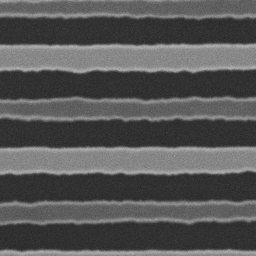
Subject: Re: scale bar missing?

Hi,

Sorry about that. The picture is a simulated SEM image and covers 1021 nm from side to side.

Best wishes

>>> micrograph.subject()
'lines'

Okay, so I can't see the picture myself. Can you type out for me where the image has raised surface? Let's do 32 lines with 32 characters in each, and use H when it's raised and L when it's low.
HHHHHHHHHHHHHHHHHHHHHHHHHHHHHHHH
HHHHHHHHHHHHHHHHHHHHHHHHHHHHHHHH
LLLLLLLLLLLLLLLLLLLLLLLLLLLLLLLL
LLLLLLLLLLLLLLLLLLLLLLLLLLLLLLLL
LLLLLLLLLLLLLLLLLLLLLLLLLLLLLLLL
LLLLLLLLLLLLLLLLLLLLLLLLLLLLLLLL
HHHHHHHHHHHHHHHHHHHHHHHHHHHHHHHH
HHHHHHHHHHHHHHHHHHHHHHHHHHHHHHHH
HHHHHHHHHHHHHHHHHHHHHHHHHHHHHHHH
LLLLLLLLLLLLLLLLLLLLLLLLLLLLLLLL
LLLLLLLLLLLLLLLLLLLLLLLLLLLLLLLL
LLLLLLLLLLLLLLLLLLLLLLLLLLLLLLLL
LLHLLHHHHHHHHHHHHHLLHHHHHHHHHHHH
HHHHHHHHHHHHHHHHHHHHHHHHHHHHHHHH
HHHHHHHHHHHHHHHHHHHHHHHHHHHHHHHH
LLLLLLLLLLLLLLLLLLLLLLLLLLLLLLLL
LLLLLLLLLLLLLLLLLLLLLLLLLLLLLLLL
LLLLLLLLLLLLLLLLLLLLLLLLLLLLLLLL
LLLHHHLLLLHHHHHHLHHHHLHHHHLLHHHH
HHHHHHHHHHHHHHHHHHHHHHHHHHHHHHHH
HHHHHHHHHHHHHHHHHHHHHHHHHHHHHHHH
HHHHHHHHHHHHHHHHHHHHHHHHHHHHHHLL
LLLLLLLLLLLLLLLLLLLLLLLLLLLLLLLL
LLLLLLLLLLLLLLLLLLLLLLLLLLLLLLLL
LLLLLLLLLLLLLLLLLLLLLLLLLLLLLLLL
HHHHHHHHHHHHHHHHHHHHHHHHHHHHHHHH
HHHHHHHHHHHHHHHHHHHHHHHHHHHHHHHH
HHHHHHHHHHHHHHHHHHHHHHHHHHHHHHHH
LLLLLLLLLLLLLLLLLLLLLLLLLLLLLLLL
LLLLLLLLLLLLLLLLLLLLLLLLLLLLLLLL
LLLLLLLLLLLLLLLLLLLLLLLLLLLLLLLL
HHHHHHHHHHHHHHHHHHHHHHHHHHHHHHHH